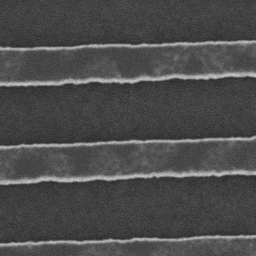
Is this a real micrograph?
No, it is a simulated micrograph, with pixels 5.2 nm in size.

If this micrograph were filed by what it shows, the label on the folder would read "lines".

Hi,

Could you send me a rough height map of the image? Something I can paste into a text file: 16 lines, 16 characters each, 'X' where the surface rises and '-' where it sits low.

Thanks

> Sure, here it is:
----------------
----------------
----------------
XXXXXXXXXXXXXXXX
XXXXXXXXXXXXXXXX
----------------
----------------
----------------
----------------
XXXXXXXXXXXXXXXX
XXXXXXXXXXXXXXXX
----------------
----------------
----------------
----------------
XXXXXXXXXXXXXXXX